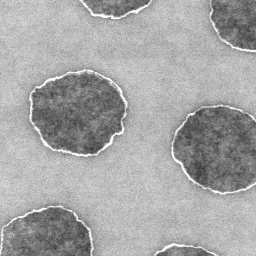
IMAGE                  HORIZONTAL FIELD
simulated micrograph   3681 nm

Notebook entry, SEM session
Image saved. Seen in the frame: raised bodies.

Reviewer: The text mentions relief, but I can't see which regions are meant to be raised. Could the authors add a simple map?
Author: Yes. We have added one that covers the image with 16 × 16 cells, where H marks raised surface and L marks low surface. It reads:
LLLLLHHHHLLLLHHH
LLLLLLLLLLLLLHHH
LLLLLLLLLLLLLLHH
LLLLLLLLLLLLLLLL
LLLLLHLLLLLLLLLL
LLHHHHHLLLLLLLLL
LLHHHHHHLLLLLLLL
LLHHHHHHLLLLHHHH
LLLHHHHLLLLHHHHH
LLLLHHLLLLLHHHHH
LLLLLLLLLLLHHHHH
LLLLLLLLLLLLHHHH
LLLLLLLLLLLLLLLL
LHHHHLLLLLLLLLLL
HHHHHHLLLLLLLLLL
HHHHHHLLLLHHHLLL